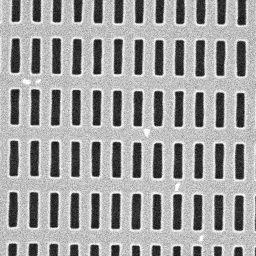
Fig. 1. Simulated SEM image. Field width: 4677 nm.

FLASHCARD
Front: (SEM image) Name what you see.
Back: groups of lines, slits or small figures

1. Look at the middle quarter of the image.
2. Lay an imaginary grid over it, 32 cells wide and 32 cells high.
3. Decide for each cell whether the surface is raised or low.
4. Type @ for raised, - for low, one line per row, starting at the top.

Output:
@@--@@@---@@---@@---@@---@@---@@
@@---@@---@@---@@---@@---@@---@@
@@--@@@--@@@--@@@@--@@@--@@@--@@
@@@@@@@@@@@@@@@@@@@@@@@@@@@@@@@@
@@@@@@@@@@@@@@@@@@@@@@@@@@@@@@@@
@@@@@@@@@@@@@@@@@@@@@@@@@@@@@@@@
@@--@@@@-@@@@@@@@@@@@@@@@@@@@@@@
@@--@@@---@@---@@---@@---@@---@@
@@--@@@--@@@---@@---@@---@@@--@@
@@--@@@--@@@---@@---@@---@@@--@@
@@--@@@--@@@---@@---@@---@@@--@@
@@--@@@--@@@---@@---@@---@@---@@
@@--@@@--@@@--@@@---@@---@@---@@
@@--@@@--@@@--@@@---@@---@@---@@
@@--@@@--@@@--@@@---@@---@@---@@
@@--@@@--@@@--@@@@-@@@@-@@@@--@@
@@@@@@@@@@@@@@@@@@@@@@@@@@@@@@@@
@@@@@@@@@@@@@@@@@@@@@@@@@@@@@@@@
@@@@@@@@@@@@@@@@@@@@@@@@@@@@@@@@
@@--@@@--@@@--@@@@-@@@@@@@@@@@@@
@@--@@@--@@@--@@@---@@---@@---@@
@@--@@@--@@@--@@@---@@---@@---@@
@@--@@@--@@@--@@@---@@---@@---@@
@@--@@@--@@@--@@@---@@---@@---@@
@@--@@@--@@@--@@@--@@@---@@---@@
@@--@@@--@@@--@@@--@@@---@@---@@
@@--@@@--@@@--@@@--@@@---@@---@@
@@--@@@--@@@--@@@--@@@---@@---@@
@@@@@@@@@@@@--@@@--@@@--@@@@-@@@
@@@@@@@@@@@@@@@@@@@@@@@@@@@@@@@@
@@@@@@@@@@@@@@@@@@@@@@@@@@@@@@@@
@@@@@@@@@@@@@@@@@@@@@@@@@@@@@@@@